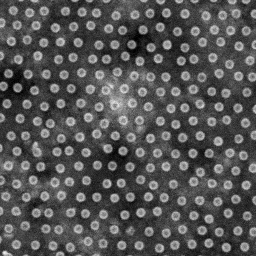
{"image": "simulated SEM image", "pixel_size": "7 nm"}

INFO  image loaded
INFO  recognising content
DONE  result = a regular array of raised bodies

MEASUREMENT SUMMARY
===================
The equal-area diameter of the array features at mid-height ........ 58.5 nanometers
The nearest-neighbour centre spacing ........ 15.1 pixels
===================